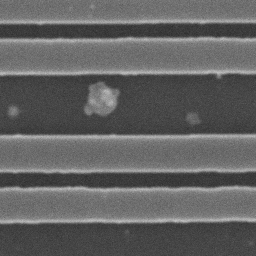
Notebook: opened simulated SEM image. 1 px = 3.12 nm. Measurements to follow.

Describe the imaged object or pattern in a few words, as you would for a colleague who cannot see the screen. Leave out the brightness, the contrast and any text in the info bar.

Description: lines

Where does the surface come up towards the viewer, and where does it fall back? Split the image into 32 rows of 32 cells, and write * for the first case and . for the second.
********************************
********************************
********************************
................................
................................
********************************
********************************
********************************
********************************
................................
................................
...........***..................
...........***..................
...........***..................
................................
................................
................................
********************************
********************************
********************************
********************************
.**..*******....................
................................
........***................*****
********************************
********************************
********************************
********************************
................................
................................
................................
................................